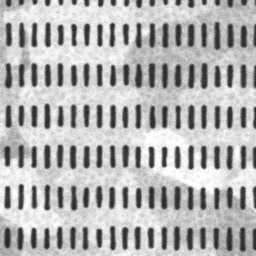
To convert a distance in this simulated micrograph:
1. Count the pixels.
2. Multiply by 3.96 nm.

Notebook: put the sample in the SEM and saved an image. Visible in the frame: a regular array of holes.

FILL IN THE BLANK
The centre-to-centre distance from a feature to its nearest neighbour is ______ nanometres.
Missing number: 50